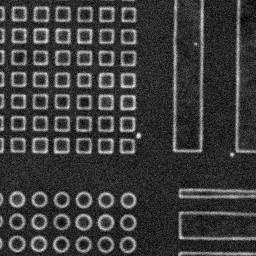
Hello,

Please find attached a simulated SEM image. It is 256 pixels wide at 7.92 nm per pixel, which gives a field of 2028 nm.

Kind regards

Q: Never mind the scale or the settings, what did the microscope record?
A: groups of lines, slits or small figures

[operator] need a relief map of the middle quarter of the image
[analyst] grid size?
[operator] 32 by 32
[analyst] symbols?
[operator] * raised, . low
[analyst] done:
............................****
............................****
*...........................****
*...***..***..****..........****
*...***..***..****..........****
*........***...***..........****
............................****
............................****
*...***..***..****..........****
*...***..***..****..........****
*...***..***..****..........****
............................****
............................****
*..****..***...**...........****
*..****..***..****..........****
*..****..***..****..........****
*..****..***..***...........****
............................****
............................****
*..****..***..***...........****
*..****..***..***...........****
*..****..***..***...........****
................................
................................
................................
................................
................................
................................
................................
................................
................................
.............................***